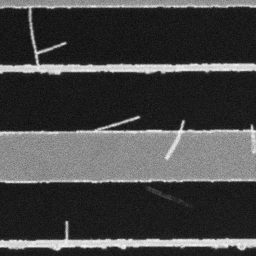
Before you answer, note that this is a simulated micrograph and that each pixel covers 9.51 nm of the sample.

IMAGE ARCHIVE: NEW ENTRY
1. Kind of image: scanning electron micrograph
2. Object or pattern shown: lines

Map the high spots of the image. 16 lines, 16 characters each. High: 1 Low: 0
0000000000000000
0000000000000000
0000000000000000
0000000000000000
0000000000000000
0000000000000000
0000000000000000
0000000000000000
1111111111111111
1111111111111111
1111111111111111
0000000000000000
0000000000000000
0000000000000000
0000000000000000
0000000000000000